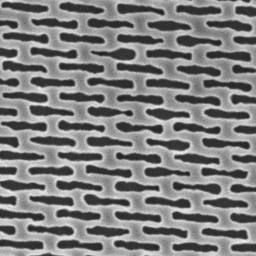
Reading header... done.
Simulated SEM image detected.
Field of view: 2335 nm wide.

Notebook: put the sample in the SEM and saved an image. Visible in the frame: a regular array of holes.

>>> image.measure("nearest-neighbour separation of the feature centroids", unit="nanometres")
267